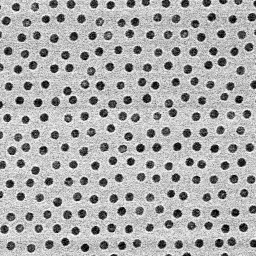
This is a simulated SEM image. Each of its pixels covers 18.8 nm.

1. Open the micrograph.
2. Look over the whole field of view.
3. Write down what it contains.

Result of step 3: a regular array of holes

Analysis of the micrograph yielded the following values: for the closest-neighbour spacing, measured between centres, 297 nanometers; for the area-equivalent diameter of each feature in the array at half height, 174 nanometers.